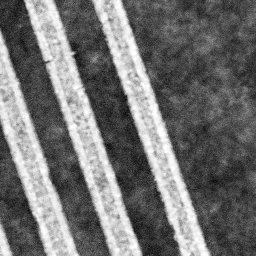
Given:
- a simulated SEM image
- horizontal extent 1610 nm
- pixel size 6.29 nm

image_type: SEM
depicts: one or a few lines or trenches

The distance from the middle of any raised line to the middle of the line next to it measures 63.3 pixels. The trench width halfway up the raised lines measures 282 nm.